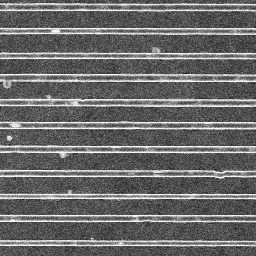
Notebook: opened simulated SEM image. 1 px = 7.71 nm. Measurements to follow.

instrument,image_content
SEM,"parallel lines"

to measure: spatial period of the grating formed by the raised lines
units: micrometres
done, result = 0.182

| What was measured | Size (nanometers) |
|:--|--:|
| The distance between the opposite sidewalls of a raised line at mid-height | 52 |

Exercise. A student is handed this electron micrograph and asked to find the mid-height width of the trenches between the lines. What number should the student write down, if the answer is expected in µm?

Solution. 0.133